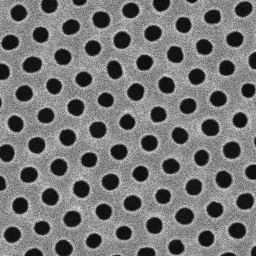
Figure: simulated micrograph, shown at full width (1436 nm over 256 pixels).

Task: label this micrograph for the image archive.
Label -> a regular array of holes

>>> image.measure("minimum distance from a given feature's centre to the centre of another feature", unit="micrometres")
0.17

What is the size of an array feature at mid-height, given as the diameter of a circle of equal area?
94 nanometers